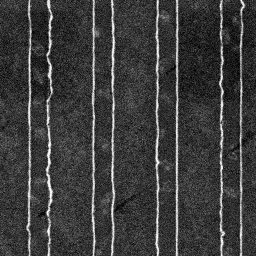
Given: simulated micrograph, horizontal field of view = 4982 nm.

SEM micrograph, one or a few lines or trenches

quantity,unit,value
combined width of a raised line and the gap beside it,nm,1240